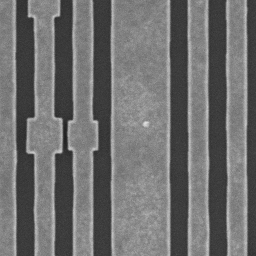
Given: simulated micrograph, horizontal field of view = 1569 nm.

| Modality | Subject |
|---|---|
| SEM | wiring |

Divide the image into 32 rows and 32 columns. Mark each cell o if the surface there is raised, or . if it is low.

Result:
oo..ooo..ooo..ooooooo...oo..ooo.
oo..ooo..ooo..ooooooo...oo..ooo.
oo..ooo..ooo..ooooooo...oo..ooo.
oo..ooo..ooo..ooooooo...oo..ooo.
oo..ooo..ooo..ooooooo...oo..ooo.
oo..ooo..ooo..ooooooo...oo..ooo.
oo..ooo..ooo..ooooooo...oo..ooo.
oo..ooo..ooo..ooooooo...oo..ooo.
oo..ooo..ooo..ooooooo...oo..ooo.
oo..ooo..ooo..ooooooo...oo..ooo.
oo..ooo..ooo..ooooooo...oo..ooo.
oo..ooo..ooo..ooooooo...oo..ooo.
oo..ooo..ooo..ooooooo...oo..ooo.
oo..ooo..oo...ooooooo...oo..ooo.
oo..ooo..ooo..ooooooo...oo..ooo.
oo.ooooo.ooo..ooooooo...oo..ooo.
oo.ooooooooo..ooooooo...oo..ooo.
oo.ooooo.ooo..ooooooo...oo..ooo.
oo.ooooo.ooo..ooooooo...oo..ooo.
oo..ooo..ooo..ooooooo...oo..ooo.
oo..ooo..ooo..ooooooo...oo..ooo.
oo..ooo..ooo..ooooooo...oo..ooo.
oo..ooo..ooo..ooooooo...oo...oo.
oo..ooo..ooo..ooooooo...oo..ooo.
oo..ooo..ooo..ooooooo...oo..ooo.
oo..ooo..ooo..ooooooo...oo..ooo.
oo..ooo..ooo..ooooooo...oo..ooo.
oo..ooo..ooo..ooooooo...oo..ooo.
oo..ooo..ooo..ooooooo...oo..ooo.
oo..ooo..ooo..ooooooo...oo..ooo.
oo..ooo..ooo..ooooooo...oo...oo.
oo..ooo..ooo..ooooooo...oo..ooo.